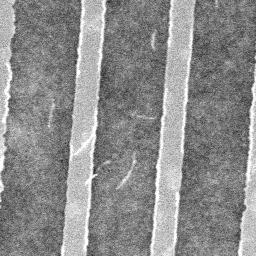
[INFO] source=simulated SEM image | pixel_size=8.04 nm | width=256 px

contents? one or a few lines or trenches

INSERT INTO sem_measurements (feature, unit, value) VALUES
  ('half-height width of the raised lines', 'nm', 187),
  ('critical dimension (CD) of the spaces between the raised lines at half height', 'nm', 523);